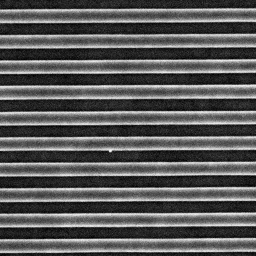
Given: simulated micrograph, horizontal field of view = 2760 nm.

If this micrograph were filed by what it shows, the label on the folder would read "parallel lines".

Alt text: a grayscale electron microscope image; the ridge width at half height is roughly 0.139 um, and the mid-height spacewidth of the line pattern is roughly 0.139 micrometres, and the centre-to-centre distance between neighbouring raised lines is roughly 276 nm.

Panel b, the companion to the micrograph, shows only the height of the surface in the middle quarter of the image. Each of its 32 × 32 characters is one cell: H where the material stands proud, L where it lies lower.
HHHHHHHHHHHHHHHHHHHHHHHHHHHHHHHH
HHHHHHHHHHHHHHHHHHHHHHHHHHHHHHHH
LLLLLLLLLLLLLLLLLLLLLLLLLLLLLLLL
LLLLLLLLLLLLLLLLLLLLLLLLLLLLLLLL
LLLLLLLLLLLLLLLLLLLLLLLLLLLLLLLL
LLLLLLLLLLLLLLLLLHHHHHHHHHHHHHHH
HHHHHHHHHHHHHHHHHHHHHHHHHHHHHHHH
HHHHHHHHHHHHHHHHHHHHHHHHHHHHHHHH
HHHHHHHHHHHHHLLLLLLLLLLLLLLLLLLL
LLLLLLLLLLLLLLLLLLLLLLLLLLLLLLLL
LLLLLLLLLLLLLLLLLLLLLLLLLLLLLLLL
LLLLLLLLLLLLLLLLLLLLLLLLLLLLLLLL
HHHHHHHHHHHHHHHHHHHHHHHHHHHHHHHH
HHHHHHHHHHHHHHHHHHHHHHHHHHHHHHHH
HHHHHHHHHHHHHHHHHHHHHHHHHHHHHHHH
LLLLLLLLLLLLLLLLLLLLLLLLLLLLLLLL
LLLLLLLLLLLLLLLLLLLLLLLLLLLLLLLL
LLLLLLLLLLLLLLLLLLLLLLLLLLLLLLLL
HHHHHHHHHHHHHHHHHHHHHHHHHHHHHHHH
HHHHHHHHHHHHHHHHHHHHHHHHHHHHHHHH
HHHHHHHHHHHHHHHHHHHHHHHHHHHHHHHH
LLLLLLLLLLLHLLLLLLLLLLLLLLLLLLLL
LLLLLLLLLLLLLLLLLLLLLLLLLLLLLLLL
LLLLLLLLLLLLLLLLLLLLLLLLLLLLLLLL
LLLLLLLLLLLLLLLLLLLLLLLLLLLLLLLL
HHHHHHHHHHHHHHHHHHHHHHHHHHHHHHHH
HHHHHHHHHHHHHHHHHHHHHHHHHHHHHHHH
HHHHHHHHHHHHHHHHHHHHHHHHHHHHHHHH
LLLLLLLLLLLLLLLLLLLLLLLLLLLLLLLL
LLLLLLLLLLLLLLLLLLLLLLLLLLLLLLLL
LLLLLLLLLLLLLLLLLLLLLLLLLLLLLLLL
HHHHHHHHHHHHHHHHHHHHHHHHHHHHHHHH